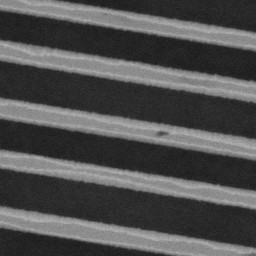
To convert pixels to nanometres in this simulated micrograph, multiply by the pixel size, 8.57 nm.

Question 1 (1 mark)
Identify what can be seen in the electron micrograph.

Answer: lines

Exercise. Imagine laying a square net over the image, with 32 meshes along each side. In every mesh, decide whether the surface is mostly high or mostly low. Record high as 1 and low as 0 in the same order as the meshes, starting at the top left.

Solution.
11111111100000000000000000000000
00011111111111100000000000000000
00000000011111111111100000000000
00000000000000011111111111100000
00000000000000000000001111111111
11000000000000000000000000001111
11111111000000000000000000000000
01111111111111000000000000000000
00000001111111111111000000000000
00000000000001111111111111100000
00000000000000000001111111111111
00000000000000000000000000111111
00000000000000000000000000000000
11111110000000000000000000000000
11111111111110000000000000000000
00000011111111111110000000000000
00000000000011111111111110000000
00000000000000000001111111111110
00000000000000000000000011111111
11111000000000000000000000000011
11111111110000000000000000000000
00000111111111110000000000000000
00000000000011111111110000000000
00000000000000000011111111110000
00000000000000000000000111111111
00000000000000000000000000000111
11100000000000000000000000000000
11111111100000000000000000000000
00111111111111110000000000000000
00000001111111111111100000000000
00000000000000111111111111110000
00000000000000000000111111111111